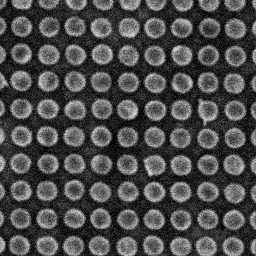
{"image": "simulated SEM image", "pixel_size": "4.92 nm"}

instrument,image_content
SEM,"a regular array of raised bodies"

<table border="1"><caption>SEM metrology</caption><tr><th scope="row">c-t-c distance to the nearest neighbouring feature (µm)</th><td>0.129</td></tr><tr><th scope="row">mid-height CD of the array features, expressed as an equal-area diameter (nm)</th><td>95.6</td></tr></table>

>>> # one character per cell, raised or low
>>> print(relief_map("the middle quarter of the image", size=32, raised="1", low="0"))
00000000000000000000000000000000
00000000000000000000000000000000
01110000110000011000001000000000
01111001111100111100011110011111
01111001111100111110111110011111
01111001111100111110011110011111
00110000111000011100011110001110
00000000000000000000000000000000
00000000000000000000000000000000
00110000111000011000001100001100
01111001111100111100011110011111
11111001111100111100111110011111
01111000111100111100011110011111
00110000011000011000001100001110
00000000000000000000000000000000
00000000000000000000000000000000
01110000111000111000011100001100
11111001111100111100111110011110
11111001111100111100111110011110
01111001111000111100011110011110
00100000000000010000001100001110
00000000000000000000000000000000
00000000000000000000000000000000
01110000111000111000011100001110
11111001111100111100111110011110
11111001111100111100111110011111
01111000111000111100011110011110
00000000000000000000010000001100
00000000000000000000000000000000
00110000000000000000000000000000
11111001111000111100011110011110
11111001111000111100111110011111